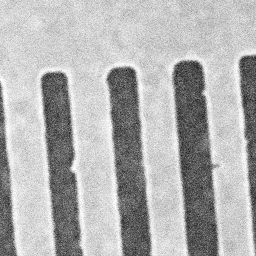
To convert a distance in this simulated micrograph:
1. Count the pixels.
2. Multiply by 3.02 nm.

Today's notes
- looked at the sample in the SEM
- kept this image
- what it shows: one or a few lines or trenches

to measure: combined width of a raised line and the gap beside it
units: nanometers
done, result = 202